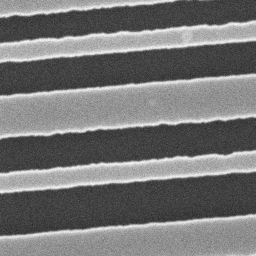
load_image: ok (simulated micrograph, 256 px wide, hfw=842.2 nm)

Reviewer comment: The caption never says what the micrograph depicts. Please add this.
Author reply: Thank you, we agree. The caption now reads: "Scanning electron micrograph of lines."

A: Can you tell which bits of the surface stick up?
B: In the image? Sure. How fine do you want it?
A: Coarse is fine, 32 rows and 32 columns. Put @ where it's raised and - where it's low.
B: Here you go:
@@@@@@@@@@@@@@@@@@--------------
@@@@@@@-------------------------
--------------------------------
----------------------@@@@@@@@@@
-----------@@@@@@@@@@@@@@@@@@@@@
@@@@@@@@@@@@@@@@@@@@@@@@@@------
@@@@@@@@@@@@@@------------------
@@@@----------------------------
--------------------------------
-----------------------------@@@
------------------@@@@@@@@@@@@@@
-----@@@@@@@@@@@@@@@@@@@@@@@@@@@
@@@@@@@@@@@@@@@@@@@@@@@@@@@@@@@@
@@@@@@@@@@@@@@@@@@@@@@@@@@@@@@@@
@@@@@@@@@@@@@@@@@@@@@@@@@@@@@@@@
@@@@@@@@@@@@@@@@@@@@-@----------
@@@@@@@@------------------------
--------------------------------
--------------------------------
-------------------------@@@@@@@
------------@@@@@@@@@@@@@@@@@@@@
--@@@@@@@@@@@@@@@@@@@@@@@@@@@---
@@@@@@@@@@@@@@@@@@--------------
@@@@@@@@------------------------
--------------------------------
--------------------------------
--------------------------------
------------------------@@@@@@@@
------------@@@@@@@@@@@@@@@@@@@@
-@@@@@@@@@@@@@@@@@@@@@@@@@@@@@@@
@@@@@@@@@@@@@@@@@@@@@@@@@@@@@@@@
@@@@@@@@@@@@@@@@@@@@@@@@@@@@@@@@